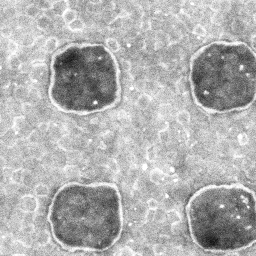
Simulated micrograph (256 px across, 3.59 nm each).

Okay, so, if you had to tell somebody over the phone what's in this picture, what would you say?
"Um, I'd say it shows raised bodies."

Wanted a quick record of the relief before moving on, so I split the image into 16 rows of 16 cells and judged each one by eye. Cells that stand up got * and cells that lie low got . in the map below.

................
................
................
...****.....****
...****.....****
...****.....****
...****.....****
................
................
................
................
....*.*.........
...*****....****
...*****....****
...*****....****
....***......**.